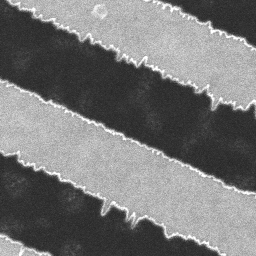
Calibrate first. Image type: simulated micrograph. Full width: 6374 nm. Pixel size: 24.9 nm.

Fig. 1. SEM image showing one or a few lines or trenches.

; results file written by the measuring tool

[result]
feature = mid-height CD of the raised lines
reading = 1.83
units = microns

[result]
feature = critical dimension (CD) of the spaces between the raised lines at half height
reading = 1570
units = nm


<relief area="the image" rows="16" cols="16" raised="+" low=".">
++.........+++++
++++.........+++
++++++.........+
++++++++........
++++++++++......
.++++++++++++...
...++++++++++++.
.....+++++++++++
........++++++++
..........++++++
+++.........++++
+++++.........++
++++++..........
++++++++........
+++++++++++.....
.++++++++++++...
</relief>